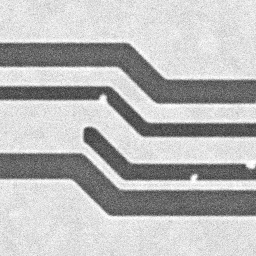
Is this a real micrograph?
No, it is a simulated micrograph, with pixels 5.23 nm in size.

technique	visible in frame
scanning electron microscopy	groups of lines, slits or small figures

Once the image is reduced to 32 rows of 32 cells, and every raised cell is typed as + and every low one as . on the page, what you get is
++++++++++++++++++++++++++++++++
++++++++++++++++++++++++++++++++
++++++++++++++++++++++++++++++++
++++++++++++++++++++++++++++++++
++++++++++++++++++++++++++++++++
................++++++++++++++++
.................+++++++++++++++
..................++++++++++++++
...................+++++++++++++
++++++++++++++++....++++++++++++
+++++++++++++++++...............
...............+++..............
................+++.............
++++++++++++++...+++++++++++++++
+++++++++++++++...++++++++++++++
++++++++++++++++................
++++++++++...++++...............
++++++++++....++++++++++++++++++
+++++++++++...++++++++++++++++++
...........+...+++++++++++++++++
............+...................
.............+..................
..............+.................
++++++++++.....+++++++++++++++++
+++++++++++.....................
++++++++++++....................
+++++++++++++...................
++++++++++++++++++++++++++++++++
++++++++++++++++++++++++++++++++
++++++++++++++++++++++++++++++++
++++++++++++++++++++++++++++++++
++++++++++++++++++++++++++++++++